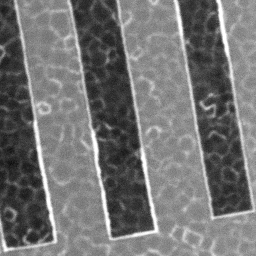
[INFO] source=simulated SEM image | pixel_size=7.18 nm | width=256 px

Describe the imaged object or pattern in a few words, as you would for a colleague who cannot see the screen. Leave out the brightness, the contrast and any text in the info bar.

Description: one or a few lines or trenches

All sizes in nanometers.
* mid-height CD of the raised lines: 303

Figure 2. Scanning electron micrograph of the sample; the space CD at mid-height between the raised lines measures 386 nm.